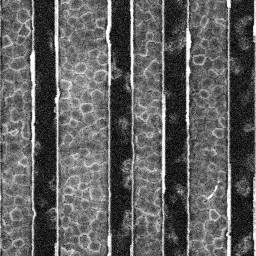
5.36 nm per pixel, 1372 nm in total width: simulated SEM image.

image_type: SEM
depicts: one or a few lines or trenches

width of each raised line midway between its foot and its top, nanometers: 135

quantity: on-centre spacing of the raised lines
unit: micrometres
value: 0.351